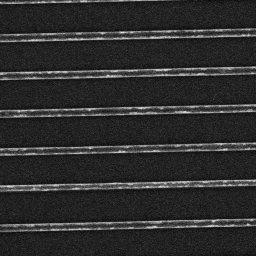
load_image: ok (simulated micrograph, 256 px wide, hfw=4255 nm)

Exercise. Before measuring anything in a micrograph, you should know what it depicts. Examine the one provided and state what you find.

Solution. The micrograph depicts parallel lines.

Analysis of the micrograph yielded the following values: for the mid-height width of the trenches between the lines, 0.505 micrometres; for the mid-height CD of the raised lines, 0.121 µm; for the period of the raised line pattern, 0.632 µm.